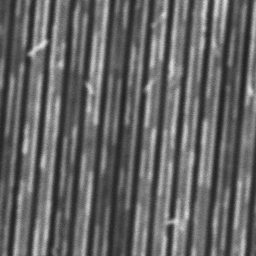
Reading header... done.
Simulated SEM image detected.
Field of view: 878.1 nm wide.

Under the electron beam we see parallel lines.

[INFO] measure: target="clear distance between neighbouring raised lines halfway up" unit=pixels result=8.34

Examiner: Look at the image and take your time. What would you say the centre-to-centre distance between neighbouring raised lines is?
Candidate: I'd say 67.4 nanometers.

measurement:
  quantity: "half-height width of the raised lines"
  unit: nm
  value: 41.4